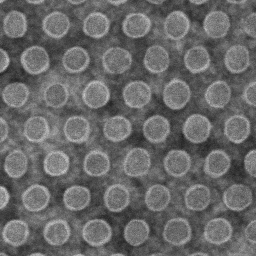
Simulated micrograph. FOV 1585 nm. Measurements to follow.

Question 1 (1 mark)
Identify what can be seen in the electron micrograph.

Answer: a regular array of raised bodies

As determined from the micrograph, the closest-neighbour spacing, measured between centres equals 244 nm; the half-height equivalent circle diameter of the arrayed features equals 155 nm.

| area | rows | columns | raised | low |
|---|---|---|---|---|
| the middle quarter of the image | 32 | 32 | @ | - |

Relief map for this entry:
@@@@@@----@@@@@@-----@@@@@-----@
-@@@-------@@@@-------@@@------@
--------------------------------
--------------------------------
---------------------------@@---
------@@@@------@@@@@-----@@@@@-
@----@@@@@@----@@@@@@@---@@@@@@-
@----@@@@@@----@@@@@@@---@@@@@@-
@----@@@@@@----@@@@@@@---@@@@@@-
-----@@@@@@----@@@@@@----@@@@@--
------@@@--------@@-------@@@---
--------------------------------
--------------------------------
--@@@-------@@@-------@@--------
-@@@@@-----@@@@@----@@@@@@-----@
@@@@@@----@@@@@@----@@@@@@----@@
@@@@@@----@@@@@@----@@@@@@----@@
@@@@@@----@@@@@@----@@@@@@----@@
-@@@@------@@@@------@@@@------@
--------------------------------
--------------------------------
-----------------@@@------------
-------@@-------@@@@@-----@@@@--
@-----@@@@@-----@@@@@----@@@@@@-
@----@@@@@@----@@@@@@----@@@@@@-
@----@@@@@@----@@@@@@----@@@@@@-
-----@@@@@@----@@@@@@-----@@@@@-
------@@@@------@@@@-------@@@--
--------------------------------
--------------------------------
------------@@--------@@@-------
-@@@@@-----@@@@------@@@@@-----@